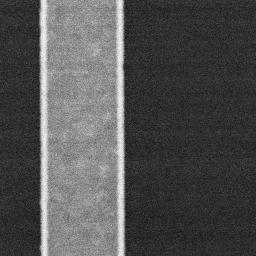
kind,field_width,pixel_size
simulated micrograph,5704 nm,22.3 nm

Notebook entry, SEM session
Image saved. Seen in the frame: one or a few lines or trenches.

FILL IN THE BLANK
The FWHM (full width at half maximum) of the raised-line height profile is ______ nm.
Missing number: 1710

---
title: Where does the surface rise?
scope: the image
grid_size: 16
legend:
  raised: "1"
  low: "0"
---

0001111000000000
0001111000000000
0001111000000000
0001111000000000
0001111000000000
0001111000000000
0001111100000000
0001111100000000
0001111100000000
0001111100000000
0001111100000000
0001111100000000
0001111100000000
0001111100000000
0001111100000000
0001111100000000